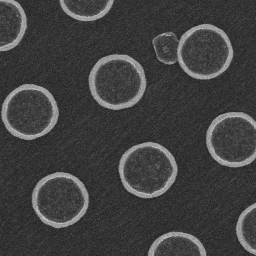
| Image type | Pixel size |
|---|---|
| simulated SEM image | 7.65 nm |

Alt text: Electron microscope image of raised bodies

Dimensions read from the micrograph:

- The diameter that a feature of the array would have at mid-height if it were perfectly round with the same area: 394 nanometres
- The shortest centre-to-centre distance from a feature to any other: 707 nanometers